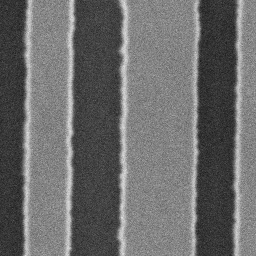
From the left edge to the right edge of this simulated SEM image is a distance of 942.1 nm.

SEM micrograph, lines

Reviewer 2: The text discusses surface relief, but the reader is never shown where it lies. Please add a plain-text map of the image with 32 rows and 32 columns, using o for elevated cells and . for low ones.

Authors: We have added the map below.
....ooooo......oooooooooo.....oo
....ooooo.......ooooooooo.....oo
....ooooo.......ooooooooo.....oo
....ooooo.......ooooooooo.....oo
....ooooo.......ooooooooo.....oo
....ooooo.......ooooooooo.....oo
...oooooo......oooooooooo.....oo
...oooooo.......ooooooooo.....oo
....ooooo......oooooooooo.....oo
....ooooo......oooooooooo.....oo
...oooooo.......ooooooooo.....oo
...oooooo......oooooooooo.....oo
...oooooo......oooooooooo.....oo
...oooooo.......ooooooooo.....oo
....ooooo......oooooooooo.....oo
...oooooo......oooooooooo.....oo
...oooooo......oooooooooo.....oo
...oooooo......oooooooooo.....oo
...oooooo......oooooooooo.....oo
...oooooo......oooooooooo.....oo
...oooooo......oooooooooo.....oo
...oooooo......oooooooooo.....oo
...oooooo......ooooooooo......oo
...oooooo......ooooooooo.....ooo
...oooooo......ooooooooo......oo
...oooooo......ooooooooo......oo
...oooooo......ooooooooo......oo
...oooooo......ooooooooo......oo
...oooooo......ooooooooo......oo
...oooooo......ooooooooo......oo
...oooooo......ooooooooo......oo
...oooooo......ooooooooo.....ooo